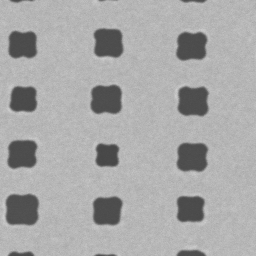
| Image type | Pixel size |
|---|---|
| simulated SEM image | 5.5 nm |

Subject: a regular array of holes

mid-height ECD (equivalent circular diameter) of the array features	168	nm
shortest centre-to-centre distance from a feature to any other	303	nanometres